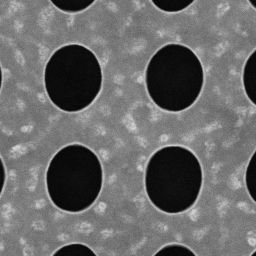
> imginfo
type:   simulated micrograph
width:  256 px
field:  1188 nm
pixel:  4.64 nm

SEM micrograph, holes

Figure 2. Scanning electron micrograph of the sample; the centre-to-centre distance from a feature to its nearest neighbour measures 464 nm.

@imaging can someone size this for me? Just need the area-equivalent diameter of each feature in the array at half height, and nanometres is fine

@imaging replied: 287